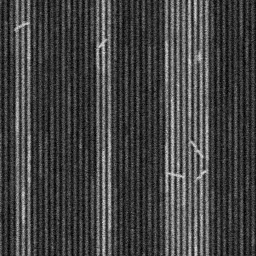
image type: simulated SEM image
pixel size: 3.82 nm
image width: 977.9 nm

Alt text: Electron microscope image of parallel lines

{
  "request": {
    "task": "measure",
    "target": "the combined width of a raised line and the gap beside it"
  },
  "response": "0.0219 um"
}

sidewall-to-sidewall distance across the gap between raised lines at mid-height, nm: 12.9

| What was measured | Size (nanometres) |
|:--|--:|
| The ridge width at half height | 9.6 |